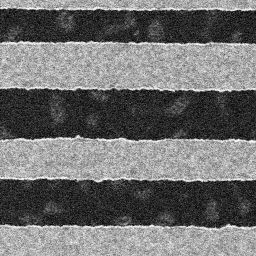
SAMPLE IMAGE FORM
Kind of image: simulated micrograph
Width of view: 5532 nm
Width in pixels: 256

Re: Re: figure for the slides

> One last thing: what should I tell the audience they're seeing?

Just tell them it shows one or a few lines or trenches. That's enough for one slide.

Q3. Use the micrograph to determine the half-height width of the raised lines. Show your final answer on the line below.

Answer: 932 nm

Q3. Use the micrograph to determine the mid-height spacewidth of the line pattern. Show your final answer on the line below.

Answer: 1020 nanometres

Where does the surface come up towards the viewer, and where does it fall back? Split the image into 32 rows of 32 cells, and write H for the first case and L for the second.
HHHHHHHHHHHHHHHHHHHHHHHHHHHHHHHH
LLLLLLLLLLLLLLLLLLLLLLLLLLLLLLLL
LLLLLLLLLLLLLLLLLLLLLLLLLLLLLLLL
LLLLLLLLLLLLLLLLLLLLLLLLLLLLLLLL
LLLLLLLLLLLLLLLLLLLLLLLLLLLLLLLL
HHHHHHHHHHHHHHHHHHHHHHLLHLHHHHHL
HHHHHHHHHHHHHHHHHHHHHHHHHHHHHHHH
HHHHHHHHHHHHHHHHHHHHHHHHHHHHHHHH
HHHHHHHHHHHHHHHHHHHHHHHHHHHHHHHH
HHHHHHHHHHHHHHHHHHHHHHHHHHHHHHHH
HHHHHHHHHHHHHHHHHHHHHHHHHHHHHHHH
LLLLLLLLLLLLLLLLLLLLLLLLLLLLLLLL
LLLLLLLLLLLLLLLLLLLLLLLLLLLLLLLL
LLLLLLLLLLLLLLLLLLLLLLLLLLLLLLLL
LLLLLLLLLLLLLLLLLLLLLLLLLLLLLLLL
LLLLLLLLLLLLLLLLLLLLLLLLLLLLLLLL
LLLLLLLLLLLLLLLLLLLLLLLLLLLLLLLL
LLHHHHHHHHHHHHHHLLLLHHHHHHLLHLLL
HHHHHHHHHHHHHHHHHHHHHHHHHHHHHHHH
HHHHHHHHHHHHHHHHHHHHHHHHHHHHHHHH
HHHHHHHHHHHHHHHHHHHHHHHHHHHHHHHH
HHHHHHHHHHHHHHHHHHHHHHHHHHHHHHHH
LLLLLLLLLLLLHLLLLLLLLLLHHHHHHLHL
LLLLLLLLLLLLLLLLLLLLLLLLLLLLLLLL
LLLLLLLLLLLLLLLLLLLLLLLLLLLLLLLL
LLLLLLLLLLLLLLLLLLLLLLLLLLLLLLLL
LLLLLLLLLLLLLLLLLLLLLLLLLLLLLLLL
LLLLLLLLLLLLLLLLLLLLLLLLLLLLLLLL
HHHHHHHHHHHHHHHHHHHHHHHHHHLLHHHH
HHHHHHHHHHHHHHHHHHHHHHHHHHHHHHHH
HHHHHHHHHHHHHHHHHHHHHHHHHHHHHHHH
HHHHHHHHHHHHHHHHHHHHHHHHHHHHHHHH